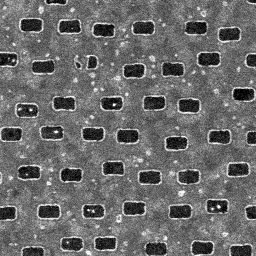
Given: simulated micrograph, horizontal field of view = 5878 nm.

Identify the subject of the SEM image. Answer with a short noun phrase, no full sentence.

a regular array of holes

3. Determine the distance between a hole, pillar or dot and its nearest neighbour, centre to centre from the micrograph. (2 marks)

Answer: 812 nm